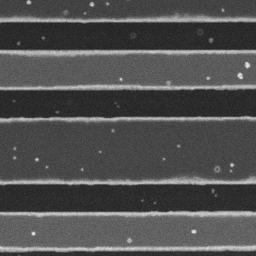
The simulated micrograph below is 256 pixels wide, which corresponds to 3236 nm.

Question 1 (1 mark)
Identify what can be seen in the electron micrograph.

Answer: lines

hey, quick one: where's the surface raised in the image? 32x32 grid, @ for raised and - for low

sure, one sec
@@@@@@@@@@@@@@@@@@@@@@@@@@@@@@@@
@@@@@@@@@@@@@@@@@@@@@@@@@@@@@@@@
@@@@@@@@@@@@@@@@@@@@@@@@@@@@@@@@
--------------------------------
--------------------------------
--------------------------------
@@@@@@@@@@@@@@@@@@@@@@@@@@@@@@@@
@@@@@@@@@@@@@@@@@@@@@@@@@@@@@@@@
@@@@@@@@@@@@@@@@@@@@@@@@@@@@@@@@
@@@@@@@@@@@@@@@@@@@@@@@@@@@@@@@@
@@@@@@@@@@@@@@@@@@@@@@@@@@@@@@@@
--------------------------------
--------------------------------
--------------------------------
--------------------------------
@@@@@@@@@@@@@@@@@@@@@@@@@@@@@@@@
@@@@@@@@@@@@@@@@@@@@@@@@@@@@@@@@
@@@@@@@@@@@@@@@@@@@@@@@@@@@@@@@@
@@@@@@@@@@@@@@@@@@@@@@@@@@@@@@@@
@@@@@@@@@@@@@@@@@@@@@@@@@@@@@@@@
@@@@@@@@@@@@@@@@@@@@@@@@@@@@@@@@
@@@@@@@@@@@@@@@@@@@@@@@@@@@@@@@@
@@@@@@@@@@@@@@@@@@@@@@@@@@@@@@@@
--------------------------------
--------------------------------
--------------------------------
----------------------------@-@@
@@@@@@@@@@@@@@@@@@@@@@@@@@@@@@@@
@@@@@@@@@@@@@@@@@@@@@@@@@@@@@@@@
@@@@@@@@@@@@@@@@@@@@@@@@@@@@@@@@
@@@@@@@@@@@@@@@@@@@@@@@@@@@@@@@@
--------------------------------